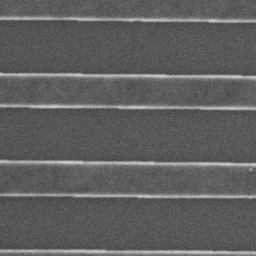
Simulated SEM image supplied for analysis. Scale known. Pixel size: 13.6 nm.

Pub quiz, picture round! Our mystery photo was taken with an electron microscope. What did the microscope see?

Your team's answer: lines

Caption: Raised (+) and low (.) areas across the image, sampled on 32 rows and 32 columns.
++++++++++++++++++++++++++++++++
++++++++++++++++++++++++++++++++
.................+++++++++++++++
................................
................................
................................
................................
................................
................................
+++++++++++++++++++++++++++.....
++++++++++++++++++++++++++++++++
++++++++++++++++++++++++++++++++
++++++++++++++++++++++++++++++++
..............++++++++++++++++++
................................
................................
................................
................................
................................
................................
+++++++++++++++++++++++++++.....
++++++++++++++++++++++++++++++++
++++++++++++++++++++++++++++++++
++++++++++++++++++++++++++++++++
.........+++++++++++++++++++++++
................................
................................
................................
................................
................................
................................
++++++++++++++++++++++..........